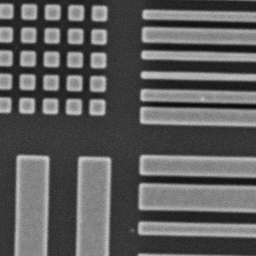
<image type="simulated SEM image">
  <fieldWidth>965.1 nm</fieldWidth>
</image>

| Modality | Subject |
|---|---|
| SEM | groups of lines, slits or small figures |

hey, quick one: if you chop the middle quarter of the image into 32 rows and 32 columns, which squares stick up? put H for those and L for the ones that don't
LHHHLLLHHHLLLLLLLLLLLLLLLLLLLLLL
LLLLLLLLLLLLLLLLLLLLLLLLLLLLLLLL
LLLLLLLLLLLLLLLLLLLHHHHHHHHHHHHH
LHHHLLLHHHLLLLLLLLLLHHHHHHHHHHHH
LHHHLLLHHHLLLLLLLLLLLLLLLLLLLLLL
LHHHLLLHHHLLLLLLLLLLLLLLLLLLLLLL
LHHHLLLHHHLLLLLLLLLHHHHHHHHHHLLL
LLLLLLLLLLLLLLLLLLLHHHHHHHHHHHHH
LLLLLLLLLLLLLLLLLLLHHHHHHHHHHHHH
LHHHLLLHHHLLLLLLLLLLLLLLLLLLLLLL
LHHHLLHHHHLLLLLLLLLLLLLLLLLLLLLL
LHHHLLHHHHLLLLLLLLLHHHHHHHHHHHHH
LHHHLLLHHHLLLLLLLLLHHHHHHHHHHHHH
LLLLLLLLLLLLLLLLLLLHHHHHHHHHHHHH
LLLLLLLLLLLLLLLLLLLHHHHHHHHHHHHH
LLLLLLLLLLLLLLLLLLLLLLLLLLLLLLLL
LLLLLLLLLLLLLLLLLLLLLLLLLLLLLLLL
LLLLLLLLLLLLLLLLLLLLLLLLLLLLLLLL
LLLLLLLLLLLLLLLLLLLLLLLLLLLLLLLL
LLLLLLLLLLLLLLLLLLLLLLLLLLLLLLLL
LLLLLLLLLLLLLLLLLLLLLLLLLLLLLLLL
LLLLLLLLLLLLLLLLLLLLLLLLLLLLLLLL
LLLLLLLLLLLLLLLLLLLLLLLLLLLLLLLL
LLLLHHHHHHHLLLLLLLLHHHHHHHHHHHHH
LLLLHHHHHHHLLLLLLLLHHHHHHHHHHHHH
LLLLHHHHHHHLLLLLLLLHHHHHHHHHHHHH
LLLLHHHHHHHLLLLLLLLHHHHHHHHHHHHH
LLLLHHHHHHHLLLLLLLLHHHHHHHHHHHHH
LLLLHHHHHHHLLLLLLLLLLLLLLLLLLLLL
LLLLHHHHHHHLLLLLLLLLLLLLLLLLLLLL
LLLLHHHHHHHLLLLLLLLHHHHHHHHHHHHH
LLLLHHHHHHHLLLLLLLLHHHHHHHHHHHHH